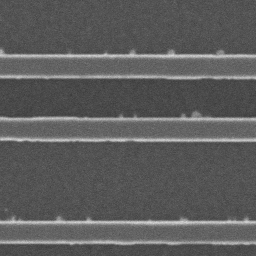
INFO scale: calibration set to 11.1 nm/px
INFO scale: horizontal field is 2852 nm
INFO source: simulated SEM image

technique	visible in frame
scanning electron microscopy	lines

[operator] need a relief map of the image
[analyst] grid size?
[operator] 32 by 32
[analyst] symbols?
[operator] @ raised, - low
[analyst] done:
--------------------------------
--------------------------------
--------------------------------
--------------------------------
--------------------------------
--------------------------------
--------------------------------
@@@@@@@@@@@@@@@@@@@@@@@@@@@@@@@@
@@@@@@@@@@@@@@@@@@@@@@@@@@@@@@@@
@@@@@@@@@@@@@@@@@@@@@@@@@@@@@@@@
--------------------------------
--------------------------------
--------------------------------
--------------------------------
--------------------------------
@@@@@@@@@@@@@@@@@@@@@@@@@@@@@@@@
@@@@@@@@@@@@@@@@@@@@@@@@@@@@@@@@
--@@@@@@@@@@@@@@@@@@@@@@@@@@@@@@
--------------------------------
--------------------------------
--------------------------------
--------------------------------
--------------------------------
--------------------------------
--------------------------------
--------------------------------
--------------------------------
--------------------------------
@@@@@@@@@@@@@@@@@@@@@@@@@@@@@@@@
@@@@@@@@@@@@@@@@@@@@@@@@@@@@@@@@
--------@@----@@@----@-----@@@@@
--------------------------------